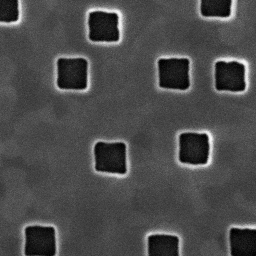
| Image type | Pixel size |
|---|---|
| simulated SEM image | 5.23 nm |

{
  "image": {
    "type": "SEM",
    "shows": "holes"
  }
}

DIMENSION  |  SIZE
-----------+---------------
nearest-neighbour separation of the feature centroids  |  294 nm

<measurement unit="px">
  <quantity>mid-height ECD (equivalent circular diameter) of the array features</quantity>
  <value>34.1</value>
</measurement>